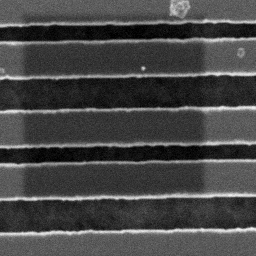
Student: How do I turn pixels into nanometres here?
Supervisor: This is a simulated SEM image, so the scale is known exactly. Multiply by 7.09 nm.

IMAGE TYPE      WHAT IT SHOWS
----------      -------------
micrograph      lines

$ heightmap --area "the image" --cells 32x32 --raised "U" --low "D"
UUUUUUUUUUUUUUUUUUUUUUUUUUUUUUUU
UUUUUUUUUUUUUUUUUUUUUUUUUUUUUUUU
UUUUUUUUUUUUUUUUUUUUUUUUUUUUUUUU
DDDDDDDDDDDDDDDDDDDDDDDDDDDDDDDD
DDDDDDDDDDDDDDDDDDDDDDDDDDDDDDDD
UUUUUUUUUUUUUUUUUUUUUUUUUUUUUUUU
UUUUUUUUUUUUUUUUUUUUUUUUUUUUUUUU
UUUUUUUUUUUUUUUUUUUUUUUUUUUUUUUU
UUUUUUUUUUUUUUUUUUUUUUUUUUUUUUUU
UUUUUUUUUUUUUUUUUUUUUUUUDDDDDDDD
DDDDDDDDDDDDDDDDDDDDDDDDDDDDDDDD
DDDDDDDDDDDDDDDDDDDDDDDDDDDDDDDD
DDDDDDDDDDDDDDDDDDDDDDDDDDDDDDDD
DDDDDDDDDDDDDDDDDDDDDDUUUUUUUUUU
UUUUUUUUUUUUUUUUUUUUUUUUUUUUUUUU
UUUUUUUUUUUUUUUUUUUUUUUUUUUUUUUU
UUUUUUUUUUUUUUUUUUUUUUUUUUUUUUUU
UUUUUUUUUUUUUUUUUUUUUUUUUUUUUUUU
DDDDDDDDDDDDDDDDDDDDDDDDDDDDDDDD
DDDDDDDDDDDDDDDDDDDDDDDDDDDDDDDD
UDDUUUUUUUUUUUUUUUUUUUUUUUUUUUUU
UUUUUUUUUUUUUUUUUUUUUUUUUUUUUUUU
UUUUUUUUUUUUUUUUUUUUUUUUUUUUUUUU
UUUUUUUUUUUUUUUUUUUUUUUUUUUUUUUU
UUUUUUUUUUUUUUUUUUUUUUUUUUUUUUUU
DDDDDDDDDDDDDDDDDDDDDDDDDDDDDDDD
DDDDDDDDDDDDDDDDDDDDDDDDDDDDDDDD
DDDDDDDDDDDDDDDDDDDDDDDDDDDDDDDD
DDDDDDDDDDDDDDDDDDDDDDDDDDDDDDDD
UUUUUUUUUUUUUUUUUUUUUUUUUUUUUUUU
UUUUUUUUUUUUUUUUUUUUUUUUUUUUUUUU
UUUUUUUUUUUUUUUUUUUUUUUUUUUUUUUU